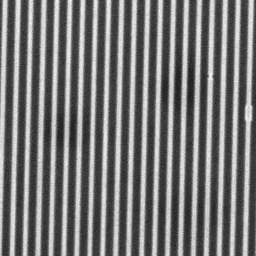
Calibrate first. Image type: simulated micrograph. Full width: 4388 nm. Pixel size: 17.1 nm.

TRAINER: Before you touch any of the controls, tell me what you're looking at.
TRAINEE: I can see parallel lines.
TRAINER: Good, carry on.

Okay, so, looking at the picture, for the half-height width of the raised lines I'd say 4.75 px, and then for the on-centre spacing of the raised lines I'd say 0.222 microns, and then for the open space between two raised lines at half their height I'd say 148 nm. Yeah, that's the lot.